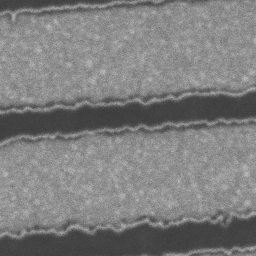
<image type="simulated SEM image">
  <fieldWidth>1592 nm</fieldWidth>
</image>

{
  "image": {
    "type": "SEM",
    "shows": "one or a few lines or trenches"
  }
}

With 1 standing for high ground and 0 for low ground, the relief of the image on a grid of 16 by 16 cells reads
1111000000000000
0000000000000000
0000000000000000
0000000000000000
0000000000000000
0000000000000000
0000011111111111
1111111111111111
1111100000000000
0000000000000000
0000000000000000
0000000000000000
0000000000000000
0000000000000001
0011111111111111
1111111111111111